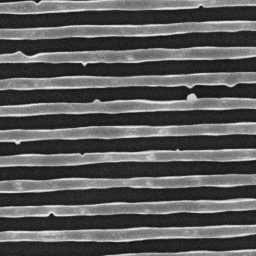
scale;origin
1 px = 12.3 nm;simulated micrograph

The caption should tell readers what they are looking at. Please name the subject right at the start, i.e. parallel lines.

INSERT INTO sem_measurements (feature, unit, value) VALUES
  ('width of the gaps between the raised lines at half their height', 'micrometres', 0.184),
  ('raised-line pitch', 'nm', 313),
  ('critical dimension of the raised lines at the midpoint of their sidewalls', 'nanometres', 127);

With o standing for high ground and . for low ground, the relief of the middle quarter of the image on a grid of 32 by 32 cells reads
................................
................................
................................
oooooooooooooooooooooooooooooooo
oooooooooooooooooooooooooooooooo
oooooooooooooooo.....oo........o
................................
................................
...............................o
.......ooo..oooooooooo.o...ooooo
oooooooooooooooooooooooooooooooo
ooooooooooooooooooooooo.........
................................
................................
................................
.............................oo.
oooooooooooooooooooooooooooooooo
oooooooooooooooooooooooooooooooo
oooo.....ooo....................
................................
................................
................................
.....ooooooooooooooooooooooooooo
oooooooooooooooooooooooooooooooo
oooooooo........................
................................
................................
................................
.......................ooooooooo
oooooooooooooooooooooooooooooooo
oooooooooooooooooooooooooooooooo
................................